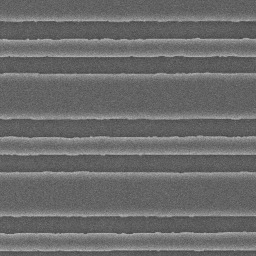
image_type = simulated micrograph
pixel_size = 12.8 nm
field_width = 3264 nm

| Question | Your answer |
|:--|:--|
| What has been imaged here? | lines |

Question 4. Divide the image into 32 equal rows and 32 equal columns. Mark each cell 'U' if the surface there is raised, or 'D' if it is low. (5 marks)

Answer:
UUUUUUUUUUUUUUUUUUUUUUUUUUUUUUUU
UUUUUUUUUUUUUUUUUUUUUUUUUUUUUUUU
UUUUUUUUUUUUUUUUUUUUUUUUUUUUUUUU
DDDDDDDDDDDDDDDDDDDDDDDDDDDDDDDD
DDDDDDDDDDDDDDDDDDDDDDDDDDDDDDDD
UUUUUUUUUUUUUUUUUUUUUUUUUUUUUUUU
UUUUUUUUUUUUUUUUUUUUUUUUUUUUUUUU
DDDDDDDDDDDDDDDDDDDDDDDDDDDDDDDD
DDDDDDDDDDDDDDDDDDDDDDDDDDDDDDDD
UUUUUUUUUUUUUUUUUUUUUUUUUUUUUUUU
UUUUUUUUUUUUUUUUUUUUUUUUUUUUUUUU
UUUUUUUUUUUUUUUUUUUUUUUUUUUUUUUU
UUUUUUUUUUUUUUUUUUUUUUUUUUUUUUUU
UUUUUUUUUUUUUUUUUUUUUUUUUUUUUUUU
UUUUUUUUUUUUUUUUUUUUUUUUUUUUUUUU
DDDDDDDDDDDDDDDDDDDDDDDDDDDDDDDD
DDDDDDDDDDDDDDDDDDDDDDDDDDDDDDDD
UUUUUUUUUUUUUUUUUUUUUUUUUUUUUUUU
UUUUUUUUUUUUUUUUUUUUUUUUUUUUUUUU
DDDDDDDDDDDDDDDDDDDDDDDDDDDDDDDD
DDDDDDDDDDDDDDDDDDDDDDDDDDDDDDDD
DDDDDUUDDUUDDDDDDDDDDDDDDDDDDDUD
UUUUUUUUUUUUUUUUUUUUUUUUUUUUUUUU
UUUUUUUUUUUUUUUUUUUUUUUUUUUUUUUU
UUUUUUUUUUUUUUUUUUUUUUUUUUUUUUUU
UUUUUUUUUUUUUUUUUUUUUUUUUUUUUUUU
UUUUUUUUUUUUUUUUUUUUUUUUUUUUUUUU
DDDDDDDDDDDDDDDDDDDDDDDDDDDDDDDD
DDDDDDDDDDDDDDDDDDDDDDDDDDDDDDDD
UUUUUUUUUUUUUUUUUUUUUUUUUUUUUUUU
UUUUUUUUUUUUUUUUUUUUUUUUUUUUUUUU
DDDDDDDDDDDDDDDDDDDDDDDDDDDDDDDD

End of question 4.